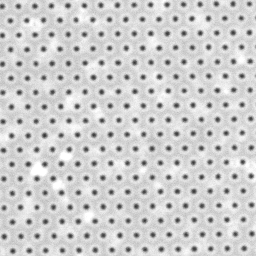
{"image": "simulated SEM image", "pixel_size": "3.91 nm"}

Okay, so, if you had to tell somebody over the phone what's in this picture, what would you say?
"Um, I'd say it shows a regular array of holes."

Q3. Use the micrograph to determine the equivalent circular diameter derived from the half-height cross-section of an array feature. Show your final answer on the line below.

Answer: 23.3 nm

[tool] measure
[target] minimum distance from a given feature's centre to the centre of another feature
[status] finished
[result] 63.3 nm